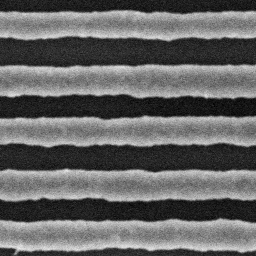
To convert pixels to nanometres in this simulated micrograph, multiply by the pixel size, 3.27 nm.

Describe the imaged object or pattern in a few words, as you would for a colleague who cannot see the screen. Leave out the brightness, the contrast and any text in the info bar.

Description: lines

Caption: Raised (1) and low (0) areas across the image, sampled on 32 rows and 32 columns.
00000000000000000000000000000000
00000000000001111000000000000001
11111111111111111111111111111111
11111111111111111111111111111111
11111111001111111111111111111111
00000000000000000000000000000000
00000000000000000000000000000000
00000000000000000000000000000000
11111110111111111111111111111111
11111111111111111111111111111111
11111111111111111111111111111111
11111111111111111111111111111111
00000000000000000000000000000000
00000000000000000000000000000000
00000000000000000000000000000000
11111111111111111111111111111111
11111111111111111111111111111111
11111111111111111111111111111111
00000000000000000000000000000000
00000000000000000000000000000000
00000000000000000000000000000000
11111111111111111110111111101111
11111111111111111111111111111111
11111111111111111111111111111111
11111111111111111111111111111111
00000000000000000000000000000000
00000000000000000000000000000000
00000000000000000000010000011000
11111111111111111111111111111111
11111111111111111111111111111111
11111111111111111111111111111111
00000000000000000000000000000000